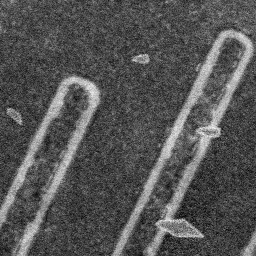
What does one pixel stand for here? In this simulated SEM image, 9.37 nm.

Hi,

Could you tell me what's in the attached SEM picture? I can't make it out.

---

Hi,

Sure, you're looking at one or a few lines or trenches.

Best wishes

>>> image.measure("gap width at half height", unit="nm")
803